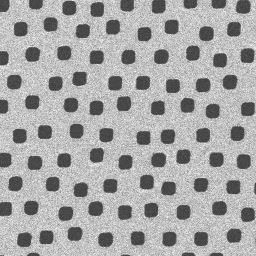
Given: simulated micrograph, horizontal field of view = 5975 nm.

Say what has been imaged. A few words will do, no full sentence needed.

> a regular array of holes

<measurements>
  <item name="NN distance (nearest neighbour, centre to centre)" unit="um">0.598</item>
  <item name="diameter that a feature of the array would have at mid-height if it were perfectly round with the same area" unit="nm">360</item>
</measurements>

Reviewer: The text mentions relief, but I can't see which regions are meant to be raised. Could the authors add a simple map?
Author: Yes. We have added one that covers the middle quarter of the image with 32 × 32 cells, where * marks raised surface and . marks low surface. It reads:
********************************
********************************
**....**************************
**....*****...****...***********
**....*****....***....****...***
***..******....***...****....***
***********...*****.******...***
********************************
*.************...*************..
....***..****....*****...****...
....**....***....*****...****...
...***....****..******...****...
******...*************...*******
********************************
********************************
**...***************************
*....****...*************..*****
*....****...******....**....****
**..*****...******....**....****
*********..*******...***...*****
********************************
*******...*******************..*
.*****....************...***....
..****....****...*****....**....
..*****..*****...*****...***...*
.*************...*****...*******
**************..****************
********************************
*******************...**********
**********...******....**..*****
***...****...******...**....****
**....****...*******.***....****